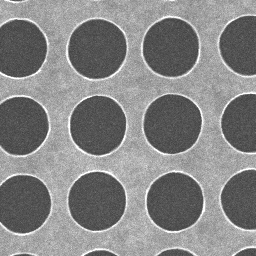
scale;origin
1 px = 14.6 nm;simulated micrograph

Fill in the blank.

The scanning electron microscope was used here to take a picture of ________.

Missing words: holes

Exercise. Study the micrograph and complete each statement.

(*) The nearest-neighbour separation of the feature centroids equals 1090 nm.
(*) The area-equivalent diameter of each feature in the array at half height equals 0.856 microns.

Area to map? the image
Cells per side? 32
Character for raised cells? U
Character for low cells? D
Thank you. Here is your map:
UUUUUUUUUUUUUUUUUUUUUUUUUUUUUUUU
UUUUUUUUUUUUUUUUUUUUUUUUUUUUUUUU
UUDUUUUUUUUDDUUUUUUUDDDUUUUUUDDD
DDDDDUUUUUDDDDDUUUUDDDDDUUUUDDDD
DDDDDDUUUDDDDDDDUUDDDDDDDUUUDDDD
DDDDDDUUUDDDDDDDUUDDDDDDDUUDDDDD
DDDDDDUUUDDDDDDDUUDDDDDDDUUDDDDD
DDDDDDUUUDDDDDDDUUDDDDDDDUUUDDDD
DDDDDUUUUDDDDDDUUUUDDDDDUUUUUDDD
UDDDUUUUUUDDDDUUUUUUDDDUUUUUUUUU
UUUUUUUUUUUUUUUUUUUUUUUUUUUUUUUU
UUUUUUUUUUUUUUUUUUUUUUUUUUUUUUUU
UDDDUUUUUUDDDDUUUUUDDDDDUUUUUDDD
DDDDDUUUUDDDDDDUUUDDDDDDDUUUDDDD
DDDDDDUUUDDDDDDDUUDDDDDDDUUUDDDD
DDDDDDUUUDDDDDDDUUDDDDDDDUUUDDDD
DDDDDDUUUDDDDDDDUUDDDDDDDUUUDDDD
DDDDDDUUUDDDDDDUUUDDDDDDDUUUDDDD
DDDDDUUUUUDDDDDUUUUDDDDDUUUUUDDD
UUDUUUUUUUUUUUUUUUUUUUUUUUUUUUUU
UUUUUUUUUUUUUUUUUUUUUUUUUUUUUUUU
UUUUUUUUUUUUUUUUUUUUUUUUUUUUUUDD
UDDDDUUUUUDDDDDUUUUUDDDDUUUUUDDD
DDDDDDUUUDDDDDDUUUUDDDDDDUUUDDDD
DDDDDDUUUDDDDDDDUUDDDDDDDUUUDDDD
DDDDDDUUUDDDDDDDUUDDDDDDDUUUDDDD
DDDDDDUUUDDDDDDUUUUDDDDDDUUUDDDD
DDDDDDUUUDDDDDDUUUUDDDDDDUUUUDDD
UDDDDUUUUUUDDDUUUUUUDDDUUUUUUUDD
UUUUUUUUUUUUUUUUUUUUUUUUUUUUUUUU
UUUUUUUUUUUUUUUUUUUUUUUUUUUUUUUU
UUUUUUUUUUUDDDUUUUUUDDDDUUUUUUDD